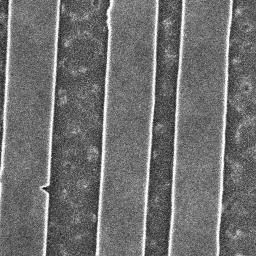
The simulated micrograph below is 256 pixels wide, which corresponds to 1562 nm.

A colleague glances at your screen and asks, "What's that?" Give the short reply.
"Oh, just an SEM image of one or a few lines or trenches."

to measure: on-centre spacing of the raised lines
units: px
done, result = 81.9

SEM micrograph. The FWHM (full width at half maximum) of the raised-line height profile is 289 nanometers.